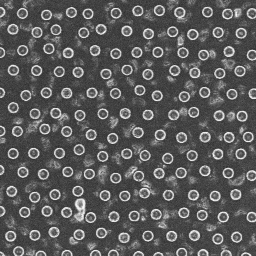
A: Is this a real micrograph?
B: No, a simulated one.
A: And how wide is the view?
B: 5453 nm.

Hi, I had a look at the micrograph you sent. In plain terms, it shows a regular array of raised bodies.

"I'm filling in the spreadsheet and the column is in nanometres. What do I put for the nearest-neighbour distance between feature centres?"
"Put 424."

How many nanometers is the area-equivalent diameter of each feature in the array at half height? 211